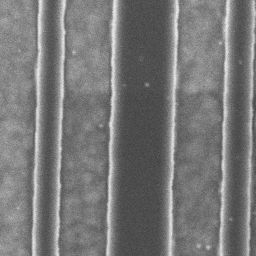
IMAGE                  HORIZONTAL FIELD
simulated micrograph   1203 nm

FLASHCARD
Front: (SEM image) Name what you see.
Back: lines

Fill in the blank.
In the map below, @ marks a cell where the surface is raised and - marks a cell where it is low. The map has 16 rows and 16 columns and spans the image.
--@@---@@@@---@@
--@@---@@@@---@@
--@@---@@@@---@@
--@@---@@@@---@@
--@@---@@@@---@@
--@@---@@@@---@@
--@@---@@@@---@@
--@@---@@@@---@@
--@@---@@@@---@@
--@@---@@@@---@@
--@@---@@@@---@@
--@@---@@@@---@@
--@@---@@@@---@@
--@@---@@@@---@@
--@@---@@@@---@@
--@@---@@@@---@@